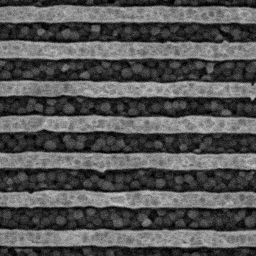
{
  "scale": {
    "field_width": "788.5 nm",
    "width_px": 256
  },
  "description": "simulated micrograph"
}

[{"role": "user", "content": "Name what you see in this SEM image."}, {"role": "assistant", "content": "parallel lines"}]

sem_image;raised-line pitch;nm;115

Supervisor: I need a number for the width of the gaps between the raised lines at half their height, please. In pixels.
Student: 22.6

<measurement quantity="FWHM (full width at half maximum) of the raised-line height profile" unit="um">0.0462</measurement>